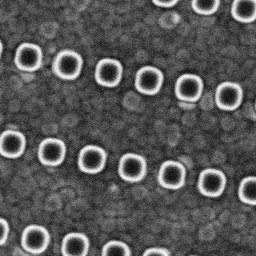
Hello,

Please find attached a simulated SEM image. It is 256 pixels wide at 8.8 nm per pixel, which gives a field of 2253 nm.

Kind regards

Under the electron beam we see a regular array of raised bodies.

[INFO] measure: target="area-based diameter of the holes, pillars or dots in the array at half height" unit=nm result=233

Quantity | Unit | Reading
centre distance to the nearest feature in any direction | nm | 358